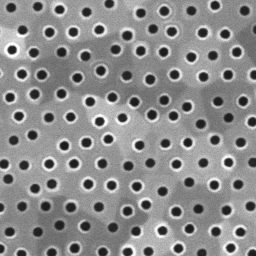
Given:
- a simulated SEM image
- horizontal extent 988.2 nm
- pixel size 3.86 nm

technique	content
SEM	a regular array of holes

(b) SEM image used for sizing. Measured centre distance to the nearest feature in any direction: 83.9 nm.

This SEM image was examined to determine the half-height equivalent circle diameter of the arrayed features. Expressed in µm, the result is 0.038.